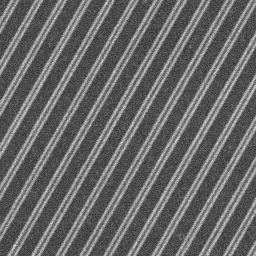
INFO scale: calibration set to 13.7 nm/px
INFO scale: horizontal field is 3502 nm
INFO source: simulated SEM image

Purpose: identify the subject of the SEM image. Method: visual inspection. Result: parallel lines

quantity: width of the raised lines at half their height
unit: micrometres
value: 0.083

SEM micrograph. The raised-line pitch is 284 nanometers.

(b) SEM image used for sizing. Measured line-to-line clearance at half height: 0.205 um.